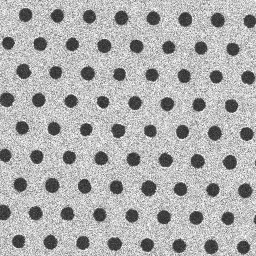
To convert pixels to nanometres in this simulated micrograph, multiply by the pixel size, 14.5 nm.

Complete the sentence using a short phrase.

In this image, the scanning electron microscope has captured a regular array of holes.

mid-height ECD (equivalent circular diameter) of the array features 201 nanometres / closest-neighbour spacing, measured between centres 462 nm